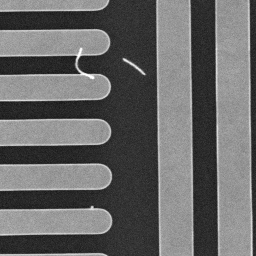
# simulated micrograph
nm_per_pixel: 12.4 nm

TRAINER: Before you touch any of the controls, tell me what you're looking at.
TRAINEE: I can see groups of lines, slits or small figures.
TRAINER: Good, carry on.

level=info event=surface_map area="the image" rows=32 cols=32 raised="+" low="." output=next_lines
+++++++++++++.......++++...++++.
....................++++...++++.
....................++++...++++.
....................++++...++++.
+++++++++++++.......++++...++++.
++++++++++++++......++++...++++.
+++++++++++++.......++++...++++.
....................++++...++++.
....................++++...++++.
+++++++++++++.......++++...++++.
++++++++++++++......++++...++++.
++++++++++++++......++++...++++.
++++++..............++++...++++.
....................++++...++++.
....................++++...++++.
+++++++++++++.......++++...++++.
++++++++++++++......++++...++++.
+++++++++++++.......++++...++++.
....................++++...++++.
....................++++...++++.
...........++.......++++...++++.
++++++++++++++......++++...++++.
++++++++++++++......++++...++++.
+++++++++++++.......++++...++++.
....................++++...++++.
....................++++...++++.
+++++++++++++.......++++...++++.
++++++++++++++......++++...++++.
++++++++++++++......++++...++++.
....................++++...++++.
....................++++...++++.
....................++++...++++.